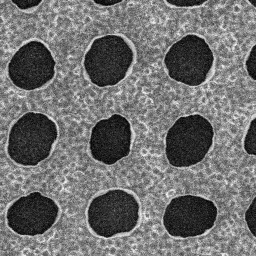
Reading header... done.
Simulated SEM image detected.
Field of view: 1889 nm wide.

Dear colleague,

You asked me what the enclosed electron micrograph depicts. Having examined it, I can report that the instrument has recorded a regular array of holes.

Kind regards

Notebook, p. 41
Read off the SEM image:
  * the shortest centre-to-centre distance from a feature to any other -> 554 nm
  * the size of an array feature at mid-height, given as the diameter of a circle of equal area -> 0.365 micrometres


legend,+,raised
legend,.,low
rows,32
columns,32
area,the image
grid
++...+++++++..+++++++....++++++.
++++++++++++++++++++++++++++++++
++++++++++++++++++++++++++++++++
++++++++++++++++++++++++++++++++
+++++++++++++..++++++++..+++++++
+++..+++++++....++++++....++++++
++....+++++......++++......++++.
+......+++.......++++......++++.
+......+++......+++++......++++.
+......++++.....+++++.....+++++.
++....++++++...++++++++..+++++++
++++++++++++++++++++++++++++++++
++++++++++++++++++++++++++++++++
++++++++++++++++++++++++++++++++
+++...++++++++.+++++++++.+++++++
++.....+++++....++++++....+++++.
+......++++.....+++++......++++.
+......++++.....+++++......++++.
+.....+++++.....+++++.....++++..
+.....+++++.....+++++.....++++++
++...++++++++.+++++++....+++++++
++++++++++++++++++++++++++++++++
++++++++++++++++++++++++++++++++
++++++++++++++++++++++++++++++++
+++...++++++.....+++++...+++++++
+......++++......++++......++++.
+......++++......++++......++++.
+......++++......+++.......++++.
+.....+++++......++++.....+++++.
++++.+++++++..++++++++...+++++++
++++++++++++++++++++++++++++++++
++++++++++++++++++++++++++++++++